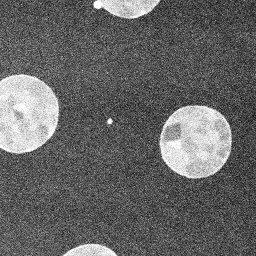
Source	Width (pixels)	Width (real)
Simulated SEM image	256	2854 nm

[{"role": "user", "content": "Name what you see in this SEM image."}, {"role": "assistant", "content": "raised bodies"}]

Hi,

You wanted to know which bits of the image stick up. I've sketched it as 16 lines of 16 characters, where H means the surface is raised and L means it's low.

LLLLLLHHHHLLLLLL
LLLLLLLLLLLLLLLL
LLLLLLLLLLLLLLLL
LLLLLLLLLLLLLLLL
LLLLLLLLLLLLLLLL
HHHLLLLLLLLLLLLL
HHHHLLLLLLLLLLLL
HHHHLLLLLLLHHHLL
HHHLLLLLLLHHHHLL
LLLLLLLLLLHHHHLL
LLLLLLLLLLLHHHLL
LLLLLLLLLLLLLLLL
LLLLLLLLLLLLLLLL
LLLLLLLLLLLLLLLL
LLLLLLLLLLLLLLLL
LLLLLHHLLLLLLLLL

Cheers